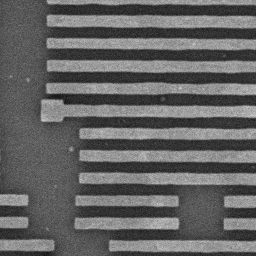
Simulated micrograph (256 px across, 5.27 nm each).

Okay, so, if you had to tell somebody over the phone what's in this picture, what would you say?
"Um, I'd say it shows wiring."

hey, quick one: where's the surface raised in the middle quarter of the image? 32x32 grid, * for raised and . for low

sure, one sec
********************************
********************************
................................
................................
................................
********************************
********************************
....................****........
................................
................................
*******.******.......***........
********************************
********************************
................................
................................
................................
....****************************
....****************************
....******************.*********
................................
................................
................................
....****************************
....****************************
................................
................................
................................
....****************************
....****************************
....****************************
................................
................................